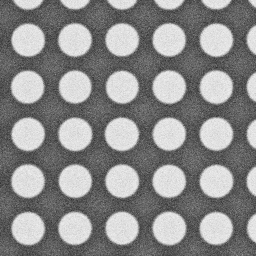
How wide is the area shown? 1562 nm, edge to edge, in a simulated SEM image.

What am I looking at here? an array of small figures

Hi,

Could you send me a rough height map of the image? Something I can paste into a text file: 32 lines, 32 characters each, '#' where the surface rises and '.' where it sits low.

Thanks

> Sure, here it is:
..###...###...###...###...##....
................................
................................
..###...###...###...##....##....
..###..####..####..####..####..#
..###..####..####..####..####..#
..###...###...###...##....##....
................................
................................
..###...###...###...###...##....
..###..####..####..####..####..#
..###...###..####..####..####..#
..###...###...##....##....##....
................................
................................
..###...###...###...###...###..#
..###..####..####..####..####..#
..###...###..####..####..####..#
..###...##....##....##....##....
................................
................................
..###...###...###...###..####..#
..###..####..####..####..####..#
..###...###..####..####..####..#
...#.....#....##....##....##....
................................
................................
..###...###...###..####..####..#
..###..####..####..####..####..#
..###...###...###..####..####..#
...#.................#..........
................................